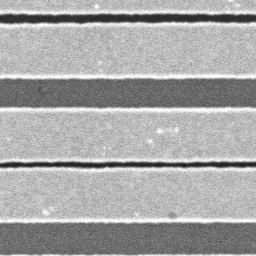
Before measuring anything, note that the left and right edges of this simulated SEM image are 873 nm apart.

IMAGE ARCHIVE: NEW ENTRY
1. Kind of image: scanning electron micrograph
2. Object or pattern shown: lines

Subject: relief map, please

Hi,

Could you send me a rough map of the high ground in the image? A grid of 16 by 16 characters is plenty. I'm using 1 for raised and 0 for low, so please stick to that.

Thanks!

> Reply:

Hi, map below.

1111111111111111
1111111111111111
1111111111111111
1111111111111111
1111111111111111
0000000000000000
0000000000000000
1111111111111111
1111111111111111
1111111111111111
1111111111111111
1111111111111111
1111111111111111
1111111111111111
0000000000000000
0000000000000000